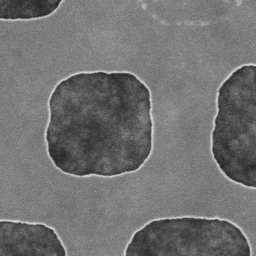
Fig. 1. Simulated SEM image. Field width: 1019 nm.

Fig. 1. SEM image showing holes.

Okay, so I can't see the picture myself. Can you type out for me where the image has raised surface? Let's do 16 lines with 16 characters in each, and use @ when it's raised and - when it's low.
---@@@@@@@@@@@@@
@@@@@@@@@@@@@@@@
@@@@@@@@@@@@@@@@
@@@@@@@@@@@@@@@@
@@@@@@@@@@@@@@@-
@@@@-----@@@@@--
@@@------@@@@@--
@@@------@@@@---
@@@------@@@@---
@@@------@@@@---
@@@@-----@@@@@--
@@@@@@@@@@@@@@@-
@@@@@@@@@@@@@@@@
@@@@@@@@@@@@@@@@
---@@@@@@------@
----@@@@--------